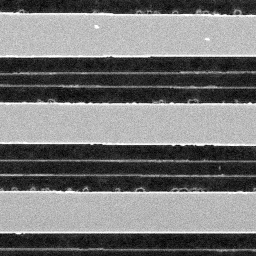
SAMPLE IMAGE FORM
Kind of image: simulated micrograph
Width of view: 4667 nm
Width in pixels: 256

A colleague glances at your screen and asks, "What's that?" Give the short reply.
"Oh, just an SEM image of lines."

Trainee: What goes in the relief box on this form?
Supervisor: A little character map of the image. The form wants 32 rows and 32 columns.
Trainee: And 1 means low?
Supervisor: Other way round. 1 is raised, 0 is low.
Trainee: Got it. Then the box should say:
00000000000000000000000000000000
00000000000000000000000000000000
11111111111111111111111111111111
11111111111111111111111111111111
11111111111111111111111111111111
11111111111111111111111111111111
11111111111111111111111111111111
00000000000000000000000000000000
00000000000000000000000000000000
11111111111111111111111111111111
11111111111111111111111111111111
00000000000000000000000000000000
00000000000000000000000000000000
11111111111111111111111111111111
11111111111111111111111111111111
11111111111111111111111111111111
11111111111111111111111111111111
11111111111111111111111111111111
00000000000000000000000000000000
00000000000000000000000000000000
11111111111111111111111111111111
11111111111111111111111111111111
00000000000000000000000000000000
00000000000000000000000000000000
11111111111111111111111111111111
11111111111111111111111111111111
11111111111111111111111111111111
11111111111111111111111111111111
11111111111111111111111111111111
00000000000000000000000000000000
00000000000000000000000000000000
11111111111111111111111111111111